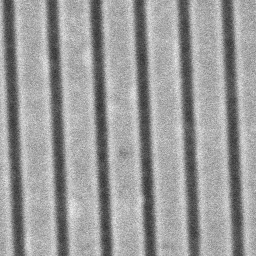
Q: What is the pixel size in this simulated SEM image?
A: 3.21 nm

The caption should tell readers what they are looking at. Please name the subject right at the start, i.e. parallel lines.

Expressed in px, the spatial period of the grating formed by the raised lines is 43.8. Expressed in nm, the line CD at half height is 100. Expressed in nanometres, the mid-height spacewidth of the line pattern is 40.1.